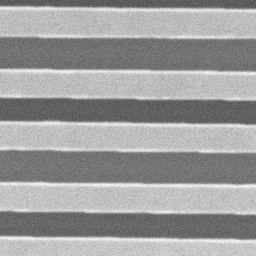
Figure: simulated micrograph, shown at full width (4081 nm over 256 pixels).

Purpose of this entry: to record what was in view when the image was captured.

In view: lines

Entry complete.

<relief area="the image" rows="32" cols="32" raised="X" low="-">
--------------------------------
XXXXXXXXXXXXXXXXXXXXXXXXXXXXXXXX
XXXXXXXXXXXXXXXXXXXXXXXXXXXXXXXX
XXXXXXXXXXXXXXXXXXXXXXXXXXXXXXXX
----XXXXXXXXXXXXXXXXXXXXXXXXXXXX
--------------------------------
--------------------------------
--------------------------------
--------------------------------
XXXXXXXXXXXXXXXXXXXXXXXXXXXXXXXX
XXXXXXXXXXXXXXXXXXXXXXXXXXXXXXXX
XXXXXXXXXXXXXXXXXXXXXXXXXXXXXXXX
--------------------------------
--------------------------------
--------------------------------
XXXXXXXXXXXXXXXXXXXXXXX---------
XXXXXXXXXXXXXXXXXXXXXXXXXXXXXXXX
XXXXXXXXXXXXXXXXXXXXXXXXXXXXXXXX
XXXXXXXXXXXXXXXXXXXXXXXXXXXXXXXX
--------------------------------
--------------------------------
--------------------------------
--------------------------------
XXXXXXXXXXXXXXXXXXXXXXXXXXXXXXXX
XXXXXXXXXXXXXXXXXXXXXXXXXXXXXXXX
XXXXXXXXXXXXXXXXXXXXXXXXXXXXXXXX
------------------XXXXXXXXXXXXXX
--------------------------------
--------------------------------
--------------------------------
XXXXXXXXXXXXXXXXXXXXXXXXXXXXXXXX
XXXXXXXXXXXXXXXXXXXXXXXXXXXXXXXX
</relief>